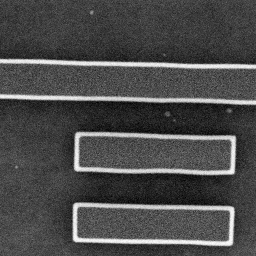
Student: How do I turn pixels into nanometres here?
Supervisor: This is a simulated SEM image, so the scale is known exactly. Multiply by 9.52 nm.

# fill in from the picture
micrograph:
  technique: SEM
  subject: groups of lines, slits or small figures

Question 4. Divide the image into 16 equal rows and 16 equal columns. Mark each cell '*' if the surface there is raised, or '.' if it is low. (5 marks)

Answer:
................
................
................
................
****************
****************
................
................
.....*****......
.....**********.
.....*********..
................
................
.....*********..
.....*********..
................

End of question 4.